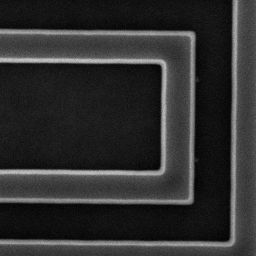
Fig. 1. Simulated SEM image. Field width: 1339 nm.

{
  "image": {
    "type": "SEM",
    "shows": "groups of lines, slits or small figures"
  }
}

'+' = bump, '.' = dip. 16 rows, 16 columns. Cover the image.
...............+
...............+
++++++++++++...+
++++++++++++...+
..........++...+
..........++...+
..........++...+
..........++...+
..........++...+
..........++...+
..........++...+
++++++++++++...+
++++++++++++...+
...............+
...............+
++++++++++++++++